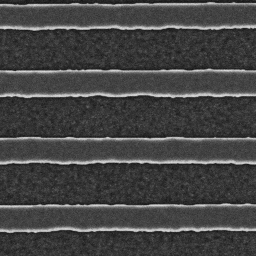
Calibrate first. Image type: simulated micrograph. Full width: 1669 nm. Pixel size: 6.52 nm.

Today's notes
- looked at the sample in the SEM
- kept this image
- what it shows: lines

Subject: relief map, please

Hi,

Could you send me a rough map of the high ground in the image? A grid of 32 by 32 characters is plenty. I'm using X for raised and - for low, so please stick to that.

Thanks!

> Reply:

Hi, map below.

---------X-------XXXXXXXXXXXXXXX
XXXXXXXXXXXXXXXXXXXXXXXXXXXXXXXX
XXXXXXXXXXXXXXXXXXXXXXXXXXXXXXXX
XXXXXXXXXXXXXXXXXXXXX-XXXXXXXXXX
--------------------------------
--------------------------------
--------------------------------
--------------------------------
--------------------------------
XXXXXXXXXXXXXXXXXXXXXXXXXXXXXXXX
XXXXXXXXXXXXXXXXXXXXXXXXXXXXXXXX
XXXXXXXXXXXXXXXXXXXXXXXXXXXXXXXX
--------------------------------
--------------------------------
--------------------------------
--------------------------------
--------------------------------
XXXXXXXXXXXXXXXXXXXXXXXXXXXXXXXX
XXXXXXXXXXXXXXXXXXXXXXXXXXXXXXXX
XXXXXXXXXXXXXXXXXXXXXXXXXXXXXXXX
--------------------------------
--------------------------------
--------------------------------
--------------------------------
--------------------------------
--------------------------------
XXXXXXXXXXXXXXXXXXXXXXXXXXXXXXXX
XXXXXXXXXXXXXXXXXXXXXXXXXXXXXXXX
XXXXXXXXXXXXXXXXXXXXXXXXXXXXXXXX
--------------------------------
--------------------------------
--------------------------------